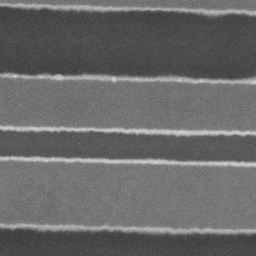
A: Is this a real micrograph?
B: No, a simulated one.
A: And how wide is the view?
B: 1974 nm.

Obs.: lines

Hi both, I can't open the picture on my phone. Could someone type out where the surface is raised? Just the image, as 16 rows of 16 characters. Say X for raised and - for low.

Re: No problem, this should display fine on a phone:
-------XXXXXXXXX
----------------
----------------
----------------
----------------
XXXXXXXXXXXXXXXX
XXXXXXXXXXXXXXXX
XXXXXXXXXXXXXXXX
XXXXXXXXXXXXXXXX
XXXXXXXXXXXXXXXX
XXXXXXXXXXXXXXXX
XXXXXXXXXXXXXXXX
XXXXXXXXXXXXXXXX
XXXXXXXXXXXXXXXX
----------------
----------------